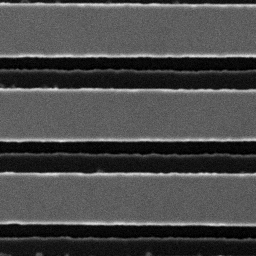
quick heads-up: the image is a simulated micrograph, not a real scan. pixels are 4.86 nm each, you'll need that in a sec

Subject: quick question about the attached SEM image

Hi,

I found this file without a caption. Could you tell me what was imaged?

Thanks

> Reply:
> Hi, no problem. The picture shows lines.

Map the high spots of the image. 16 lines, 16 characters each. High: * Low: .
****************
****************
****************
****************
................
................
****************
****************
****************
................
................
****************
****************
****************
................
................